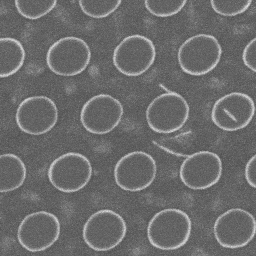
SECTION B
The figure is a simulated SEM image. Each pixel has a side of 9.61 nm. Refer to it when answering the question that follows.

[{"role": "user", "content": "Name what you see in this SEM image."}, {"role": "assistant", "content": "a regular array of raised bodies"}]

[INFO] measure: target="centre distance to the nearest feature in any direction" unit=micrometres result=0.625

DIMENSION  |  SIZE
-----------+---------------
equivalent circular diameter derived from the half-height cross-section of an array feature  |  381 nm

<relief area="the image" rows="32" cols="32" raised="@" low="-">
--@@@@@---@@@@@---@@@@@---@@@@@-
--@@@@-----@@@-----@@@-----@@@--
--------------------------------
--------------------------------
------------------------@@------
@@-----@@@@----@@@@----@@@@----@
@@@---@@@@@---@@@@@---@@@@@@---@
@@@---@@@@@---@@@@@---@@@@@----@
@@----@@@@@----@@@@----@@@-----@
--------------------------------
--------------------------------
--------------------------------
---@@@-----@@@-----@@@@-----@@@-
--@@@@@---@@@@@----@@@@@---@@@@@
--@@@@@---@@@@@---@@@@@----@@@@@
--@@@@@---@@@@@----@@@@----@@@@-
---@@@------@-------------------
--------------------------------
--------------------------------
@@------@@------@@@-----@@@-----
@@@----@@@@----@@@@----@@@@@---@
@@@---@@@@@---@@@@@----@@@@@---@
@@@---@@@@@---@@@@@----@@@@----@
@@-----@@@-----@@@------@@------
--------------------------------
--------------------------------
------------@@------@@@-----@@@-
---@@@@----@@@@----@@@@@---@@@@@
--@@@@@----@@@@@---@@@@@---@@@@@
--@@@@@----@@@@----@@@@@---@@@@@
---@@@-----@@@@----@@@@-----@@@-
--------------------------------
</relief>